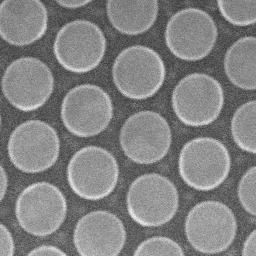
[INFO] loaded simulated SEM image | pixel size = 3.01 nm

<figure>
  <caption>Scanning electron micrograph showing a regular array of raised bodies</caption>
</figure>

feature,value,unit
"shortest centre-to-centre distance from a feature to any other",63.2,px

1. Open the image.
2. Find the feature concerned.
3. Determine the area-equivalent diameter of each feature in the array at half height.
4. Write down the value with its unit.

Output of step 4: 50.7 pixels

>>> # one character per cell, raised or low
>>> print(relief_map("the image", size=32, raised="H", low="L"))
HHHHHLLLHHHLLHHHHHHHLLLLLLLHHHHH
HHHHHHLLLLLLLHHHHHHHLLHHHLLLHHHH
HHHHHHLLLLLLLLHHHHHLLHHHHHLLLHHH
HHHHHHLLHHHHLLLHHHLLLHHHHHHLLLLL
HHHHHLLHHHHHHLLLLLLLLHHHHHHLLLLL
LLHLLLLHHHHHHLLLLLLLLHHHHHHLLHHH
LLLLLLLHHHHHHLLHHHHLLLHHHHLLHHHH
LLHHHLLHHHHHHLLHHHHHLLLLLLLLHHHH
LHHHHHLLHHHHLLHHHHHHLLLLLLLLHHHH
HHHHHHLLLLLLLLHHHHHHLLLLHHLLLHHH
HHHHHHHLLLLLLLHHHHHHLLHHHHHLLHHH
LHHHHHLLLHHHHLLHHHHLLLHHHHHHLLLL
LHHHHHLLHHHHHHLLLLLLLLHHHHHHLLLL
LLHHLLLLHHHHHHLLLLLLLLHHHHHHLLHH
LLLLLLLLHHHHHHLLLHHHLLHHHHHLLHHH
LLLHHHLLHHHHHLLLHHHHHLLHHHLLLHHH
LLHHHHHLLHHHLLLHHHHHHLLLLLLLLHHH
LHHHHHHLLLLLLLLHHHHHHLLLHHHLLHHH
LHHHHHHLLLLHLLLHHHHHHLLHHHHHLLHH
LHHHHHHLLHHHHHLLHHHHLLLHHHHHHLLL
LLHHHHLLLHHHHHLLLLLLLLHHHHHHHLLL
LLLLLLLLLHHHHHHLLLLLLLLHHHHHLLLH
HLLLLLLLLHHHHHHLLHHHHLLHHHHHLLHH
HLLHHHHLLHHHHHLLHHHHHHLLLHLLLLHH
LLLHHHHHLLHHHLLLHHHHHHLLLLLLLLHH
LLHHHHHHLLLLLLLLHHHHHHLLLHHHLLHH
LLHHHHHHLLLLHLLLHHHHHHLLHHHHHLLH
LLHHHHHHLLHHHHHLLHHHHLLHHHHHHLLL
HLLHHHHLLLHHHHHLLLLLLLLHHHHHHLLL
HLLLLLLLLHHHHHHHLLLLLLLHHHHHHLLH
HHLLLLLLLHHHHHHLLLHHHHLLHHHHHLLH
HHLLHHHHLLHHHHHLLHHHHHHLLHHLLLHH